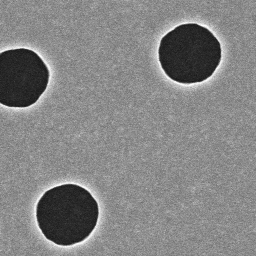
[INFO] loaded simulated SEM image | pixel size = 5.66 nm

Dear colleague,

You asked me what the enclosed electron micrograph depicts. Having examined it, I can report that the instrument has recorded holes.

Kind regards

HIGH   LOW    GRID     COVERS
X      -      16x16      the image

XXXXXXXXXXXXXXXX
XXXXXXXXXXXXXXXX
XXXXXXXXXX----XX
--XXXXXXXX----XX
---XXXXXXX---XXX
---XXXXXXXXXXXXX
--XXXXXXXXXXXXXX
XXXXXXXXXXXXXXXX
XXXXXXXXXXXXXXXX
XXXXXXXXXXXXXXXX
XXXXXXXXXXXXXXXX
XXXXXXXXXXXXXXXX
XXX---XXXXXXXXXX
XX----XXXXXXXXXX
XXX---XXXXXXXXXX
XXXXXXXXXXXXXXXX